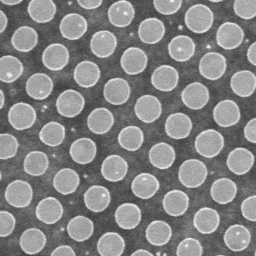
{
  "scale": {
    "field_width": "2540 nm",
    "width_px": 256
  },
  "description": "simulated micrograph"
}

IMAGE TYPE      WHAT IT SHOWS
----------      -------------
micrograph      a regular array of raised bodies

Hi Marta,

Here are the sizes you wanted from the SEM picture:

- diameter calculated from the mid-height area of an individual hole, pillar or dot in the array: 255 nanometres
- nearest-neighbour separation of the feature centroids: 340 nanometres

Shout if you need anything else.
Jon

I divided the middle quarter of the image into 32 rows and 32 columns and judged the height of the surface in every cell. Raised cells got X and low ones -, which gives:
---XXXXX-------XXXXX----XX------
---XXXXXX------XXXXX---XXXXX----
---XXXXXX-------X-----XXXXXX----
---XXXXXX-------------XXXXXX----
---XXXXX---XXXX-------XXXXXX----
----XXX---XXXXXX-------XXXXX---X
----------XXXXXX--------XXX---XX
XXXX------XXXXXX--------------XX
XXXXX-----XXXXXX---XXXX-------XX
XXXXX------XXXX---XXXXXX------XX
XXXXX-------------XXXXXX-------X
XXXX----XXX-------XXXXXX--------
XXX----XXXXX------XXXXXX----XX--
------XXXXXX-------XXXX---XXXXX-
------XXXXXX--------------XXXXXX
------XXXXXX-------------XXXXXXX
-------XXXX----XXXX-------XXXXX-
--------------XXXXX-------XXXXX-
--------------XXXXXX-------XX---
---XXXX-------XXXXX-------------
--XXXXXX-------XXXX----XXX------
--XXXXXX--------------XXXXX-----
--XXXXXX-------------XXXXXXX----
--XXXXX----XXX-------XXXXXXX----
---XXX----XXXXX-------XXXXX---XX
----------XXXXXX-------XXX---XXX
XX-------XXXXXXX-------------XXX
XXX-------XXXXX----XX--------XXX
XXXX------XXXX----XXXXX------XXX
XXXX-------------XXXXXX------XXX
XXX--------------XXXXXXX------XX
XXX---XXXXX------XXXXXX---------